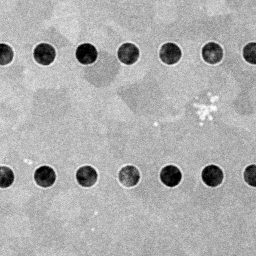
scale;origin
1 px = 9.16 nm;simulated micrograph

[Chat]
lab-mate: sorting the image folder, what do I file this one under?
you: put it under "a regular array of holes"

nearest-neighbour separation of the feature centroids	383	nm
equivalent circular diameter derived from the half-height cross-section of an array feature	213	nanometers